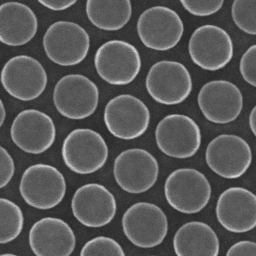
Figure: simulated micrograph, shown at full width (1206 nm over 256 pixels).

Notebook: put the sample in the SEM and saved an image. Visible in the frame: a regular array of raised bodies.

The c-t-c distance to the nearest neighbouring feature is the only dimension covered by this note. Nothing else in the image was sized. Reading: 54.2 px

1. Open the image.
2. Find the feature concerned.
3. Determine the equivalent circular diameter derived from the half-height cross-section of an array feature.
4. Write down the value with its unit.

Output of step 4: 207 nm